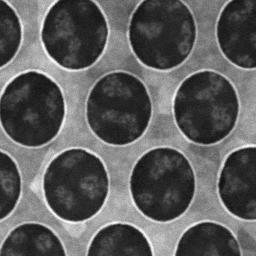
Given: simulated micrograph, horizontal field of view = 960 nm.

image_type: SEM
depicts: holes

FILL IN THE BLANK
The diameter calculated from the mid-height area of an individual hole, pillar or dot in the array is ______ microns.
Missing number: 0.263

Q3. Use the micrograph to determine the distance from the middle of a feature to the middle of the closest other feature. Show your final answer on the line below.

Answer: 327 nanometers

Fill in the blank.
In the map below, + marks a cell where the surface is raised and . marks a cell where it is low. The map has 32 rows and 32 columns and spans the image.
.++++++.....+++++......+++++....
..++++.......++++.......++++....
..++++.......+++........+++.....
...++.........++.........++.....
...++........+++........+++.....
...++........+++........+++.....
..++++.......++++.......++++....
.++++++.....+++++......++++++...
++++++++...++++++++...++++++++..
++....+++++++....+++++++....++++
+......+++++......+++++......+++
........+++.......++++........++
........+++........+++........++
........+++........+++........++
........+++........+++........++
........+++........+++........++
+......+++++......+++++......+++
++.....++++++....+++++++....++++
+++++++++++++++++++...+++++++++.
.++++++.....++++++.....++++++...
..++++.......++++.......++++....
..++++.......+++........++++....
...++.........++........+++.....
...++.........++........+++.....
...+++.......+++........+++.....
..++++.......++++.......++++....
.++++++.....++++++.....++++++...
++++++++...++++++++...+++++++++.
++....+++++++....+++++++.....+++
+......+++++......+++++......+++
........+++........+++........++
........+++........+++........++